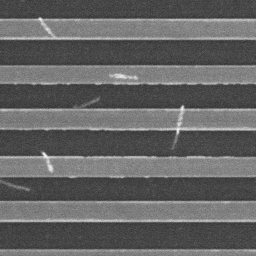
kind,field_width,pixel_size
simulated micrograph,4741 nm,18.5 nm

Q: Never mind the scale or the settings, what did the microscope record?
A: lines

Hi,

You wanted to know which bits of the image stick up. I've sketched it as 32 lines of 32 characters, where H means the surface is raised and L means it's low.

LLLLLLLLLLLLLLLLLLLLLLLLLLLLLLLL
LLLLLLLLLLLLLLLLLLLLLLLLLLLLLLLL
HHHHHHHHHHHHHHHHHHHHHHHHHHHHHHHH
HHHHHHHHHHHHHHHHHHHHHHHHHHHHHHHH
HHHHHHHHHHHHHHHHHHHHHHHHHHHHHHHH
LLLLLLLLLLLLLLLLLLLLLLLLLLLLLLLL
LLLLLLLLLLLLLLLLLLLLLLLLLLLLLLLL
LLLLLLLLLLLLLLLLLLLLLLLLLLLLLLLL
HHHHHHHHHHHHHHHHHHHHHHHHHHHHHHHH
HHHHHHHHHHHHHHHHHHHHHHHHHHHHHHHH
LLLLLLLLLLLLLLLLLLLLLLLLLLLLLLLL
LLLLLLLLLLLLLLLLLLLLLLLLLLLLLLLL
LLLLLLLLLLLLLLLLLLLLLLLLLLLLLLLL
LLLLLLLLLLLLLLLLLLLLLLLLLLLLLLLL
HHHHHHHHHHHHHHHHHHHHHHHHHHHHHHHH
HHHHHHHHHHHHHHHHHHHHHHHHHHHHHHHH
LLLLLLLLLLLLLLLLLLLLLLLLLLLLLLLL
LLLLLLLLLLLLLLLLLLLLLLLLLLLLLLLL
LLLLLLLLLLLLLLLLLLLLLLLLLLLLLLLL
LLLLLHLLLLLLLLLLLLLLLLLLLLLLLLLL
HHHHHHHHHHHHHHHHHHHHHHHHHHHHHHHH
HHHHHHHHHHHHHHHHHHHHHHHHHHHHHHHH
LLLLLLLLLLLLLLLLLLLLLLLLLLLLLLLL
LLLLLLLLLLLLLLLLLLLLLLLLLLLLLLLL
LLLLLLLLLLLLLLLLLLLLLLLLLLLLLLLL
HHHHHHHHHHHHHHHHHHHHHHHHHHHHHHHH
HHHHHHHHHHHHHHHHHHHHHHHHHHHHHHHH
HHHHHHHHHHHHHHHHHHHHHHHHHHHHHHHH
LLLLLLLLLLLLLLLLLLLLLLLLLLLLLLLL
LLLLLLLLLLLLLLLLLLLLLLLLLLLLLLLL
LLLLLLLLLLLLLLLLLLLLLLLLLLLLLLLL
HHHHHHHHHHHHHHHHHHHHHHHHHHHHHHHH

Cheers